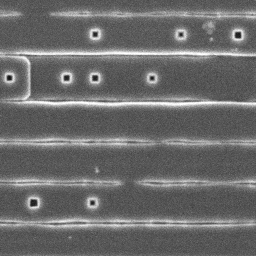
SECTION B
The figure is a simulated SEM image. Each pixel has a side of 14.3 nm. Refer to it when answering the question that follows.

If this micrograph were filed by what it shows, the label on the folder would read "wiring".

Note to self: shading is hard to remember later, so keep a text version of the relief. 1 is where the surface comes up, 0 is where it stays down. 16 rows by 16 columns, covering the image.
1111111111111111
1111111111111111
1111111111111111
1100000000000000
1100000000000000
1100000000000000
1111111111111111
1111111111111111
1111111111111111
1111111111111111
1111111111111111
1111111111111111
1111111111111111
1111111111111111
1111111111111111
1111111111111111